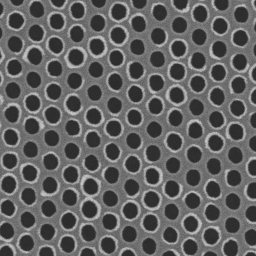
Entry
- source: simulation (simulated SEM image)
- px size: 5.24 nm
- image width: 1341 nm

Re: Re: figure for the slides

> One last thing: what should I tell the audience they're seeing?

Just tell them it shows a regular array of holes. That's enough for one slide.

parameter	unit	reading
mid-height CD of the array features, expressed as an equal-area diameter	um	0.0793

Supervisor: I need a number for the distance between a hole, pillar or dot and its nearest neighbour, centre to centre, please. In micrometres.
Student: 0.121